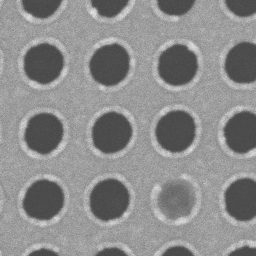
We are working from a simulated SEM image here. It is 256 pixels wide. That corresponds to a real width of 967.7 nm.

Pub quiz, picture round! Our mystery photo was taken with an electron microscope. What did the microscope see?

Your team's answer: a regular array of holes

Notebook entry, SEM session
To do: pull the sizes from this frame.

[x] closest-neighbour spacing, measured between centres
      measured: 249 nm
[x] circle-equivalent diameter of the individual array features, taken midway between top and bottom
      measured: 155 nanometers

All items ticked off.